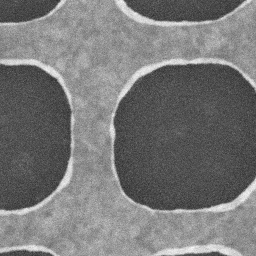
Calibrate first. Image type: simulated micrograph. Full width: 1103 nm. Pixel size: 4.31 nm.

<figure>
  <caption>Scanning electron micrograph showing holes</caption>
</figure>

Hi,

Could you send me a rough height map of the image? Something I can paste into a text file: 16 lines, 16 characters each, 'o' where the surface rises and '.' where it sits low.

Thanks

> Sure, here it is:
....oooo.......o
oooooooooo.ooooo
oooooooooooooooo
oooooooooooooooo
...oooooo......o
....oooo........
....ooo.........
....ooo.........
....ooo.........
....ooo.........
....ooo.........
....oooo........
...ooooo.......o
oooooooooooooooo
oooooooooooooooo
o.oooooooooooooo